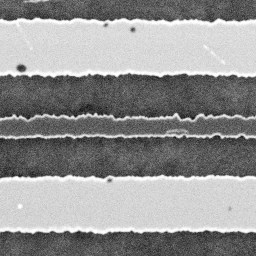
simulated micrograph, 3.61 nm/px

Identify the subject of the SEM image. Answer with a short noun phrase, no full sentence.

lines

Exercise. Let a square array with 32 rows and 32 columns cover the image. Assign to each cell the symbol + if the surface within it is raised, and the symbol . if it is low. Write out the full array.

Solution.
................................
................................
..+++++..+++..++.+......+..+...+
++++++++++++++++++++++++++++++++
++++++++++++++++++++++++++++++++
++++++++++++++++++++++++++++++++
++++++++++++++++++++++++++++++++
++++++++++++++++++++++++++++++++
++++++++++++++++++++++++++++++++
......+.......................++
................................
................................
................................
................................
.....+++..++++.......+...+.+.+..
++++++++++++++++++++++++++++++++
++++++++++++++++++++++++++++++++
................................
................................
................................
................................
................................
++++++++++++++++++++++++++++++++
++++++++++++++++++++++++++++++++
++++++++++++++++++++++++++++++++
++++++++++++++++++++++++++++++++
++++++++++++++++++++++++++++++++
++++++++++++++++++++++++++++++++
++++++++++++++++++++++++++++++++
................................
................................
................................